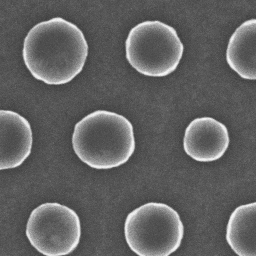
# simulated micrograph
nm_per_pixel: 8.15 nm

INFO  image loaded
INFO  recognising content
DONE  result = raised bodies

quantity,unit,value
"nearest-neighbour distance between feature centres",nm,815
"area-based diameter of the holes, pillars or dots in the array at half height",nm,458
